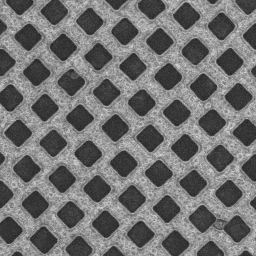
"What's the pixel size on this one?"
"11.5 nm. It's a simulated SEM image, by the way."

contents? a regular array of holes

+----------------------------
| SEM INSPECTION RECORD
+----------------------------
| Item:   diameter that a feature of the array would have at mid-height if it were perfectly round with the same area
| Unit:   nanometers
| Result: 284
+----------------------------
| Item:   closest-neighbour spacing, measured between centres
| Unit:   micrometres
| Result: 0.417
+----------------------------